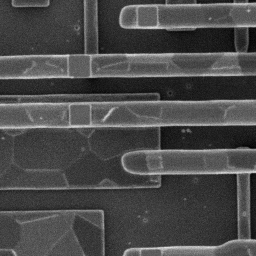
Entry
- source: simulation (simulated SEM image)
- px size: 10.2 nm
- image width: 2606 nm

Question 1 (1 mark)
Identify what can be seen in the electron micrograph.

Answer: wiring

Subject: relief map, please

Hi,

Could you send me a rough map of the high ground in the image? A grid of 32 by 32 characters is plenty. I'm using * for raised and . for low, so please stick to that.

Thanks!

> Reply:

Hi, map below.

..............................**
...............*****************
...............*****************
...............********.........
................................
................................
................................
********************************
********************************
*******************.............
................................
................................
..............................**
********************************
********************************
********************************
................................
................................
................................
...............*****************
...............*****************
................****************
................................
................................
................................
................................
................................
................................
................................
................................
............................****
................****************